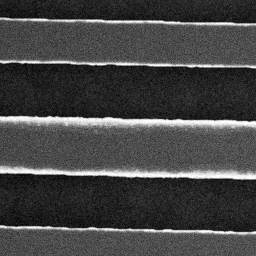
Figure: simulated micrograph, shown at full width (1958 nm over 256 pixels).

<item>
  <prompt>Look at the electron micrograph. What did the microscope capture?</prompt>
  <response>lines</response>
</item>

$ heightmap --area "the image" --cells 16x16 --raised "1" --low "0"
0000000000000000
1111111111111110
1111111111111111
1111111111111111
0000000000000000
0000000000000000
0000000000000000
1111111101000000
1111111111111111
1111111111111111
1111111111111111
0000000000000000
0000000000000000
0000000000000000
1111111111111111
1111111111111111